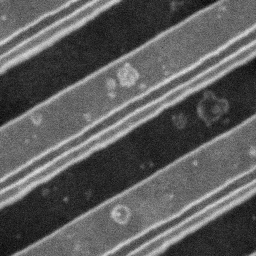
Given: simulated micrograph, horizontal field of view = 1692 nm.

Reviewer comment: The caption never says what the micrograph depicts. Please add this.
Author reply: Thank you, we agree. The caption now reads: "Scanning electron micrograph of lines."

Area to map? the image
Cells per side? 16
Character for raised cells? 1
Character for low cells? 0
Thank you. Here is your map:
1111110000000111
1111100000011111
1110000000111111
1000000011111111
0000001111111100
0000111111110000
0001111111100000
0111111110000000
1111111000000011
1111110000001111
1111000000111111
1100000001111111
1000000111111110
0000011111111000
0001111111110000
0011111111000000